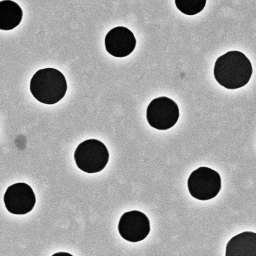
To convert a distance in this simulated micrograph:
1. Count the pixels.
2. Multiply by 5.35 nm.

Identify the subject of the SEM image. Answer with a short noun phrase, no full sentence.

a regular array of holes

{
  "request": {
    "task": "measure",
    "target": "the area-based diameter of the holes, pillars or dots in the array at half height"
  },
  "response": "178 nm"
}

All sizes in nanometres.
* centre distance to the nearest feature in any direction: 440